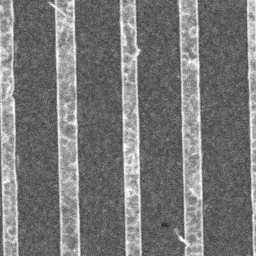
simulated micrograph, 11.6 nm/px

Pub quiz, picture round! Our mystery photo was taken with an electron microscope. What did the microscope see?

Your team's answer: one or a few lines or trenches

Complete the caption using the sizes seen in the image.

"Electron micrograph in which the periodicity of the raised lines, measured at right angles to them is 714 nm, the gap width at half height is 530 nm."